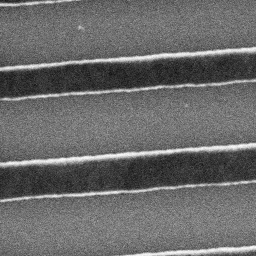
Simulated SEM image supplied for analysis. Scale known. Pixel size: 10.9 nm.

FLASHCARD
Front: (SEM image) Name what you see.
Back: lines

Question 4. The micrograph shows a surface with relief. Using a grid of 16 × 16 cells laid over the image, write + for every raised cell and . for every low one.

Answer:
................
................
................
.........+++++++
++++++++++++++++
++++++++++......
................
................
................
.........+++++++
++++++++++++++++
+++++++++++++++.
+...............
................
................
...............+